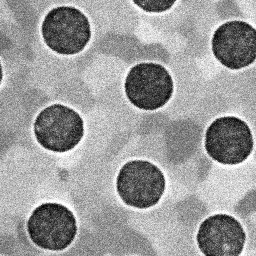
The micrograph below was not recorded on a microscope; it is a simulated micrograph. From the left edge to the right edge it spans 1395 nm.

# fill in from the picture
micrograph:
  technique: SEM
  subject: holes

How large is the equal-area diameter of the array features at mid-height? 272 nm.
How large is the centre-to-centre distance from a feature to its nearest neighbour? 0.534 um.